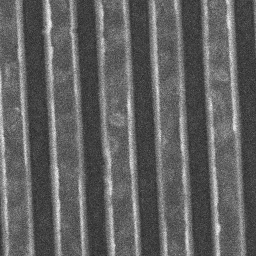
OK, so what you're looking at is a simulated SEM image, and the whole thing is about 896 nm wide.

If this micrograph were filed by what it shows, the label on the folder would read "parallel lines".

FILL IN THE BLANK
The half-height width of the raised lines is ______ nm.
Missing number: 103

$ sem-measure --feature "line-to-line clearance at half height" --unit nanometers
81.2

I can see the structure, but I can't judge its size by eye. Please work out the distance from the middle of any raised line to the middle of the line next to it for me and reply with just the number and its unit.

52.6 pixels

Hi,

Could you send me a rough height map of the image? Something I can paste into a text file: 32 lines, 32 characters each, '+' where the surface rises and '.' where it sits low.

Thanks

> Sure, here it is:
+++...+++...++++...+++...++++...
+++...+++...++++...+++...++++...
+++...+++...++++...+++...++++...
+++...+++...++++...+++...++++...
+++...+++...++++...++++...+++...
+++...+++...++++...++++...+++...
+++...++++..++++...++++...+++...
+++...++++...+++...++++...+++...
+++...++++...+++...++++...+++...
+++...++++...+++...++++...+++...
+++...++++...+++...++++...+++...
+++...++++...+++...++++...+++...
+++...++++...+++...++++...++++..
+++...++++...+++....+++...++++..
+++...++++...+++....+++...++++..
+++...++++...++++...+++...++++..
+++...++++...++++...+++...++++..
+++...++++...++++...+++...++++..
+++....+++...++++...+++...++++..
+++....+++...++++...+++...++++..
++++...+++...++++...+++...++++..
++++...+++...++++...+++...++++..
++++...+++...++++...+++...++++..
++++...+++...++++...+++...++++..
++++...+++...++++...++++...+++..
++++...+++...++++...++++...+++..
++++...++++..++++...++++...+++..
.+++...++++...+++...++++...+++..
.+++...++++...+++...++++...+++..
.+++...++++...+++...++++...+++..
.+++...++++...+++...++++...+++..
.+++...++++...+++...++++...+++..